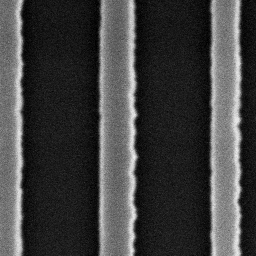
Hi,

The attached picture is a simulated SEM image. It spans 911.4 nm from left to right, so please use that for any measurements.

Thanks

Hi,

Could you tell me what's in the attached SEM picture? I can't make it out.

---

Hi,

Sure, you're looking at lines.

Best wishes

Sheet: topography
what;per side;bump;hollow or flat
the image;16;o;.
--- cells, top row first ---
o.....oo.....oo.
o.....oo.....oo.
o.....oo.....oo.
o.....oo.....oo.
o.....oo.....oo.
o.....oo.....oo.
o.....oo.....oo.
o.....oo.....oo.
o.....oo.....oo.
o.....oo.....oo.
o.....oo.....oo.
o.....oo.....oo.
o.....oo.....oo.
o.....oo.....oo.
o.....oo.....oo.
o.....oo.....oo.